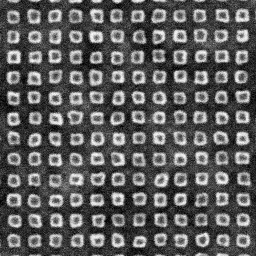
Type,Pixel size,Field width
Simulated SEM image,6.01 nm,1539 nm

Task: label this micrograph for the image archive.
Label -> a regular array of raised bodies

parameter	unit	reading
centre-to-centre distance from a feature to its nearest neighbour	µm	0.119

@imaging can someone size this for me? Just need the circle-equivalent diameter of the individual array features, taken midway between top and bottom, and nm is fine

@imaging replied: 74